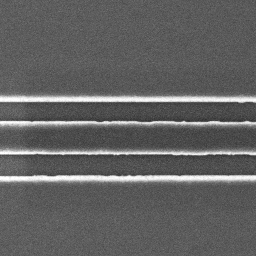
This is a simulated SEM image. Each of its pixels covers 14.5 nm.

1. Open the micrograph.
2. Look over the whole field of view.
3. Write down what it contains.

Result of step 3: lines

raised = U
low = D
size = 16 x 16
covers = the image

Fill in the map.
UUUUUUUUUUUUUUUU
UUUUUUUUUUUUUUUU
UUUUUUUUUUUUUUUU
UUUUUUUUUUUUUUUU
UUUUUUUUUUUUUUUU
UUUUUUUUUUUUUUUU
DDDDDDDDDDDDDDDD
DDDDDDDDDDDDDDDD
DDDDDDDDDDDDDDDD
DDDDDDDDDDDDDDDD
DDDDDDDDDDDDDDDD
UUUUUUUUUUUUUUUU
UUUUUUUUUUUUUUUU
UUUUUUUUUUUUUUUU
UUUUUUUUUUUUUUUU
UUUUUUUUUUUUUUUU